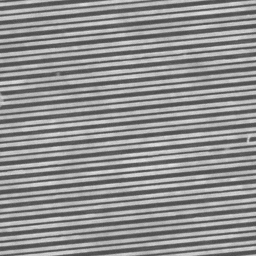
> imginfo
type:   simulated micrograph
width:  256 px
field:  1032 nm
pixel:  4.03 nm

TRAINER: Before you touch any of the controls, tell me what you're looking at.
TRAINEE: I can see parallel lines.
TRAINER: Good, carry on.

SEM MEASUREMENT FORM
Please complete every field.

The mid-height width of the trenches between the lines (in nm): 18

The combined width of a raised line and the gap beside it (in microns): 0.0283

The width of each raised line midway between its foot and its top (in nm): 14.5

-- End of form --